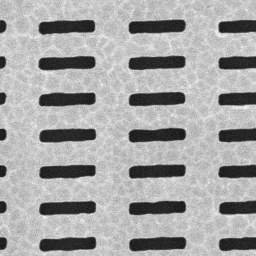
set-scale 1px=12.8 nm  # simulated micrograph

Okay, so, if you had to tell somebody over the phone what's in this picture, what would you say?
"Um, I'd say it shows a regular array of holes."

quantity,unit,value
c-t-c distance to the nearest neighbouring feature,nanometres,461